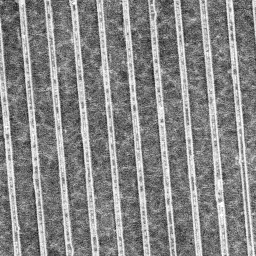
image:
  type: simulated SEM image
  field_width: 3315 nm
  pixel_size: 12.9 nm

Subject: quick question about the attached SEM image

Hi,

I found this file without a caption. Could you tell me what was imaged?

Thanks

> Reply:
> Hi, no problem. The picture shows parallel lines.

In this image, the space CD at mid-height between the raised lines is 263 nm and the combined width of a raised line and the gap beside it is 334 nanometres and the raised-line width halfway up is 69.3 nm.